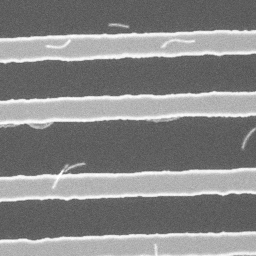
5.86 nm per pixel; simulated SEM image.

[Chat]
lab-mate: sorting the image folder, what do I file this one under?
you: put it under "lines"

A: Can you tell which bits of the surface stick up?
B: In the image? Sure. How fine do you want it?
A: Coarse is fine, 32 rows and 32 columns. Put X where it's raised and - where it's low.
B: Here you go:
--------------------------------
--------------------------------
--------------------------------
--------------------------------
----------XXXXXXXXXXXXXXXXXXXXXX
XXXXXXXXXXXXXXXXXXXXXXXXXXXXXXXX
XXXXXXXXXXXXXXXXXXXXXXXXXXXXXXXX
XXXXX--XXX----------------------
--------------------------------
--------------------------------
--------------------------------
--------------------------------
--X-XXXXXXXXXXXXXXXXXXXXXXXXXXXX
XXXXXXXXXXXXXXXXXXXXXXXXXXXXXXXX
XXXXXXXXXXXXXXXXXXXXXX-------X--
--------------------------------
--------------------------------
--------------------------------
--------------------------------
--------------------------------
--------------------------------
-----------------------XXXXXXXXX
XXXXXXXXXXXXXXXXXXXXXXXXXXXXXXXX
XXXXXXXXXXXXXXXXXXXXXXXXXXXXXXXX
XXXXXXXXXXXXXXXXXXXX------------
--------------------------------
--------------------------------
--------------------------------
--------------------------------
-------------X-XXXXXXXXXXXXXXXXX
XXXXXXXXXXXXXXXXXXXXXXXXXXXXXXXX
XXXXXXXXXXXXXXXXXXXXXXXXXXXXXXXX